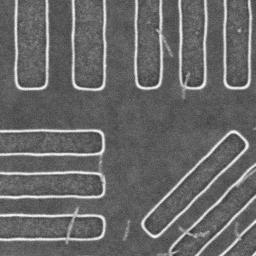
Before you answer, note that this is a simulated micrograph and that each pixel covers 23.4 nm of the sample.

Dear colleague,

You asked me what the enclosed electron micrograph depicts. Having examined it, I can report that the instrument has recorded groups of lines, slits or small figures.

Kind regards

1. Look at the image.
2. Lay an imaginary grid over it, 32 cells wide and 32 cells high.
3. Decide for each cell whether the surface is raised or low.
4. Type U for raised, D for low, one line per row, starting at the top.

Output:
UUDDDDUUUDDDDUUUUDDDUUDDDDUUDDDU
UUDDDDUUUDDDDUUUUDDDUUUDDDUUDDDU
UUDDDDUUUDDDDUUUUDDDUUUDDDUUDDDU
UUDDDDUUUDDDDUUUUDDDUUUDDDUUDDDU
UUDDDDUUUDDDDUUUUDDDUUUDDDUUDDDU
UUDDDDUUUDDDDUUUUDDDUUUDDDUUDDDU
UUDDDDUUUDDDDUUUUDDDUUUDDDUUDDDU
UUDDDDUUUDDDDUUUUDDDUUUDDDUUDDDU
UUDDDDUUUDDDDUUUUDDDUUUDDDUUDDDU
UUDDDDUUUDDDDUUUUDDDUUUDDDUUDDDU
UUDDDDUUUDDDDUUUUDDDUUUDDUUUDDDU
UUUUUUUUUUUUUUUUUUUUUUUUUUUUUUUU
UUUUUUUUUUUUUUUUUUUUUUUUUUUUUUUU
UUUUUUUUUUUUUUUUUUUUUUUUUUUUUUUU
UUUUUUUUUUUUUUUUUUUUUUUUUUUUUUUU
UUUUUUUUUUUUUUUUUUUUUUUUUUUUUUUU
DDDDDDDDDDDDUUUUUUUUUUUUUUUUUUUU
DDDDDDDDDDDDDUUUUUUUUUUUUUUUDDUU
DDDDDDDDDDDDDUUUUUUUUUUUUUUDDDDU
UUUUUUUUUUUUUUUUUUUUUUUUUUDDDDUU
UUUUUUUUUUUUUUUUUUUUUUUUUDDDDUUU
UUUUUUUUUUUUUUUUUUUUUUUUDDDDUUUD
DDDDDDDDDDDDDUUUUUUUUUUDDDDUUUDD
DDDDDDDDDDDDDUUUUUUUUUDDDDUUUDDD
DDDDDDDDDDDDUUUUUUUUUDDDDUUUDDDD
UUUUUUUUUUUUUUUUUUUUDDDDUUUDDDDU
UUUUUUUUUUUUUUUUUUUDDDDUUUDDDDUU
DDDDDDDDDDDDDUUUUUDDDDUUUDDDDUUU
DDDDDDDDDDDDDUUUUUDDDUUUDDDDUUUD
DDDDDDDDDDDDDUUUUUUUUUUDDDDUUUDD
UUUUUUUUUUUUUUUUUUUUUUDDDDUUUDDD
UUUUUUUUUUUUUUUUUUUUUDDDDUUUDDDD